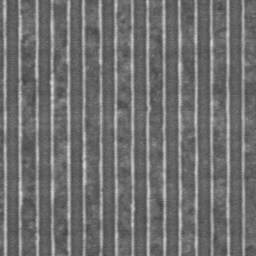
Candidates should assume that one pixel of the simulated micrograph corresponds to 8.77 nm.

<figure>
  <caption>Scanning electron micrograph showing parallel lines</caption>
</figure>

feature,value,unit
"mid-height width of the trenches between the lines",15.4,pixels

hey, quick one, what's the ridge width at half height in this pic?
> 16.5 pixels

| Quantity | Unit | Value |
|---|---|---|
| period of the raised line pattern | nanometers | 279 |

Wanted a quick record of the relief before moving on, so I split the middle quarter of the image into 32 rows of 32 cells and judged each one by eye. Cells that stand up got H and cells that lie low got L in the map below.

HLLLLHHHHLLLLHHHHLLLLHHHHLLLLHHH
HLLLLHHHHLLLLHHHHLLLLHHHHLLLLHHH
HLLLLHHHHLLLLHHHHLLLLHHHHLLLLHHH
HLLLLHHHHLLLLHHHHLLLLHHHHLLLLHHH
HLLLLHHHHLLLLHHHHLLLLHHHHLLLLHHH
HLLLLHHHHLLLLHHHHLLLLHHHHLLLLHHH
HLLLLHHHHLLLLHHHHLLLLHHHHLLLLHHH
HLLLLHHHHLLLLHHHHLLLLHHHHLLLLHHH
HLLLLHHHHLLLLHHHHLLLLHHHHLLLLHHH
HLLLLHHHHLLLLHHHHLLLLHHHHLLLLHHH
HLLLLHHHHLLLLHHHHLLLLHHHHLLLLHHH
HLLLLHHHHLLLLHHHHLLLLHHHHLLLLHHH
HLLLLHHHHLLLLHHHHLLLLHHHHLLLLHHH
HLLLLHHHHLLLLHHHHLLLLHHHHLLLLHHH
HLLLLHHHHLLLLHHHHLLLLHHHHLLLLHHH
HLLLLHHHHLLLLHHHHLLLLHHHHLLLLHHH
HLLLLHHHHLLLLHHHHLLLLHHHHLLLLHHH
HLLLLHHHHLLLLHHHHLLLLHHHHLLLLHHH
HLLLLHHHHLLLLHHHHLLLLHHHHLLLLHHH
HLLLLHHHHLLLLHHHHLLLLHHHHLLLLHHH
HLLLLHHHHLLLLHHHHLLLLHHHHLLLLHHH
HLLLLHHHHLLLLHHHHLLLLHHHHLLLLHHH
HLLLLHHHHLLLLHHHHLLLLHHHHLLLLHHH
HLLLLHHHHLLLLHHHHLLLLHHHHLLLLHHH
HLLLLHHHHLLLLHHHHLLLLHHHHLLLLHHH
HLLLLHHHHLLLLHHHHLLLLHHHHLLLLHHH
HLLLLHHHHLLLLHHHHLLLLHHHHLLLLHHH
HLLLLHHHHLLLLHHHHLLLLHHHHLLLLHHH
HLLLLHHHHLLLLHHHHLLLLHHHHLLLLHHH
HLLLLHHHHLLLLHHHHLLLLHHHHLLLLHHH
HLLLLHHHHLLLLHHHHLLLLHHHHLLLLHHH
HLLLLHHHHLLLLHHHHLLLLHHHHLLLLHHH